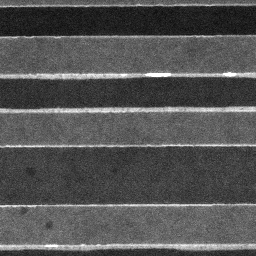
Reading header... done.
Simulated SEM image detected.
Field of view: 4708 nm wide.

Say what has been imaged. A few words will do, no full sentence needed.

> lines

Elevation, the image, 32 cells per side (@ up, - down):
@@@@@@@@@@@@@@@@@@@@@@@@@@@@@@@@
--------------------------------
--------------------------------
--------------------------------
--------------------------------
@@@@@@@@@@@@@@@@@@@@@@@@@@@@@@@@
@@@@@@@@@@@@@@@@@@@@@@@@@@@@@@@@
@@@@@@@@@@@@@@@@@@@@@@@@@@@@@@@@
@@@@@@@@@@@@@@@@@@@@@@@@@@@@@@@@
-------------------@@-----------
--------------------------------
--------------------------------
--------------------------------
--------------------------------
@@@@@@@@@@@@@@@@@@@@@@@@@@@@@@@@
@@@@@@@@@@@@@@@@@@@@@@@@@@@@@@@@
@@@@@@@@@@@@@@@@@@@@@@@@@@@@@@@@
@@@@@@@@@@@@@@@@@@@@@@@@@@@@@@@@
--------------------------------
--------------------------------
--------------------------------
--------------------------------
--------------------------------
--------------------------------
--------------------------------
--------------------------------
@@@@@@@@@@@@@@@@@@@@@@@@@@@@@@@@
@@@@@@@@@@@@@@@@@@@@@@@@@@@@@@@@
@@@@@@@@@@@@@@@@@@@@@@@@@@@@@@@@
@@@@@@@@@@@@@@@@@@@@@@@@@@@@@@@@
@@@@@@@@@@@@@@@@@@@@@@@@@@@@@@@@
--------------------------------